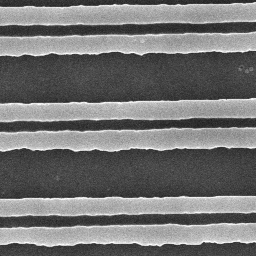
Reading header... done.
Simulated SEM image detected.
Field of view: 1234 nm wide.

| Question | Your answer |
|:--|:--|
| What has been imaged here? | lines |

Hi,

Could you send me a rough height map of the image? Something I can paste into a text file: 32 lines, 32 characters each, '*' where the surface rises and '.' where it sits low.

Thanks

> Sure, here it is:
.............................***
********************************
********************************
********************************
********************************
********************************
**************.***********.**...
................................
................................
................................
................................
................................
...........................*****
********************************
********************************
********************************
********************************
********************************
***************************....*
................................
................................
................................
................................
................................
................................
********************************
********************************
********************************
********************************
********************************
*...******.......********.......
................................